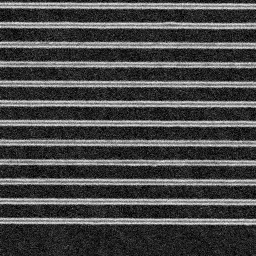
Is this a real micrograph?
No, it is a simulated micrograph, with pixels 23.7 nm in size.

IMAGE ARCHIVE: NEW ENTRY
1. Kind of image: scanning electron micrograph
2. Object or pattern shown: parallel lines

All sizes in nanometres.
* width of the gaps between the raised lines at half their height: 377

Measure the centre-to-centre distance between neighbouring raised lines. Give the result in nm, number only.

465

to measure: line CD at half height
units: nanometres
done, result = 95